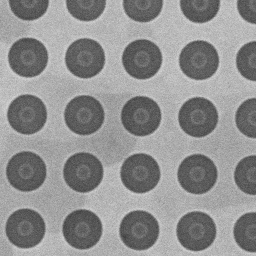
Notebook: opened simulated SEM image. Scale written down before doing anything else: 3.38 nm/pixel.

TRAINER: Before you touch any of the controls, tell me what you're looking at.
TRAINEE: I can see an array of small figures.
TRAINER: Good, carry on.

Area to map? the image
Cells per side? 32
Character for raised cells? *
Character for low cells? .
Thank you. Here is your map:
*.....**.....**.....**......**..
**....***....***....***....***..
***.******..*****..*****..*****.
********************************
********************************
**...****...****...****...*****.
*.....**.....**.....***....***..
*.....**.....**.....**.....**...
*.....**.....**.....***....***..
**...****...****...****....***..
********************************
********************************
**...****...****...****...*****.
*.....**.....**.....***....***..
*.....**.....**.....**.....**...
*.....**.....**.....**.....**...
**...****...****...****...****..
********************************
********************************
**...****...****...*****..*****.
*.....**.....**.....**.....***..
*.....**.....**.....**.....**...
*.....**.....**.....**.....**...
**...****...****...****...****..
********************************
********************************
**...****...****..******.******.
*....***.....**.....**.....***..
*.....**.....**.....**.....**...
*.....**.....**.....**.....**...
**...****...****...****...****..
*******************************.